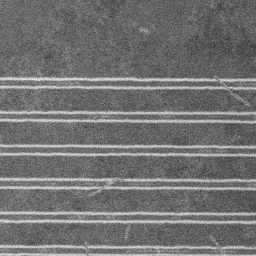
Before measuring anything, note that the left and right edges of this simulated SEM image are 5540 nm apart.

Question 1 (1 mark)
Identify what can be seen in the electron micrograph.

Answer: parallel lines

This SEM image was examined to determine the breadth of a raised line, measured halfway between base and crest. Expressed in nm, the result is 173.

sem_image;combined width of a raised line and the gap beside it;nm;725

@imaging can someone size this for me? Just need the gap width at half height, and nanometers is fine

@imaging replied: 538